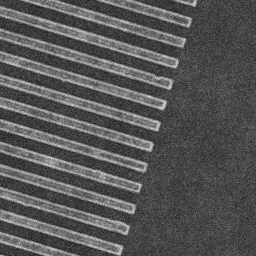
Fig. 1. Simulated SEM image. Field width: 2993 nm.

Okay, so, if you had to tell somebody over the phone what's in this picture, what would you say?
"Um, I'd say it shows parallel lines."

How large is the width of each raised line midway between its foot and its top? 88.2 nanometers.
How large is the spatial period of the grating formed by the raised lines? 0.252 µm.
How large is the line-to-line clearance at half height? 167 nm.